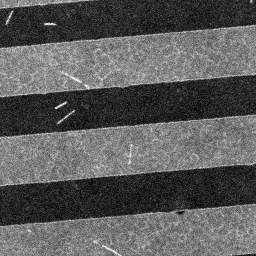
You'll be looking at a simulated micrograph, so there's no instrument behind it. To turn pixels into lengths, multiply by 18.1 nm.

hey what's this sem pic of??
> one or a few lines or trenches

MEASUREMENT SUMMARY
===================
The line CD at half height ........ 746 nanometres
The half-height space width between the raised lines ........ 0.863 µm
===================